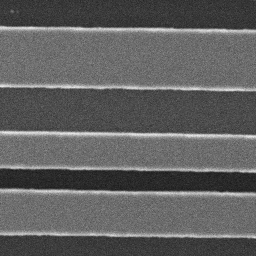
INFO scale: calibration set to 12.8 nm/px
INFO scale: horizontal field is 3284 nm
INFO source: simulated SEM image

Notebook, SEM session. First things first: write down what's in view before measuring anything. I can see lines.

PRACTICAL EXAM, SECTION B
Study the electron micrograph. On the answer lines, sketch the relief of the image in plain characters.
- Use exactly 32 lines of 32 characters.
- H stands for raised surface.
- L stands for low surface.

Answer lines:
LLLLLLLLLLLLLLLLLLLLLLLLLLLLLLLL
LLLLLLLLLLLLLLLLLLLLLLLLLLLLLLLL
LLLLLLLLLLLLLLLLLLLLLLLLLLLLLLLL
HHHHHHLLLLLLLLLLLLLLLLLLLLLLLLLL
HHHHHHHHHHHHHHHHHHHHHHHHHHHHHHHH
HHHHHHHHHHHHHHHHHHHHHHHHHHHHHHHH
HHHHHHHHHHHHHHHHHHHHHHHHHHHHHHHH
HHHHHHHHHHHHHHHHHHHHHHHHHHHHHHHH
HHHHHHHHHHHHHHHHHHHHHHHHHHHHHHHH
HHHHHHHHHHHHHHHHHHHHHHHHHHHHHHHH
HHHHHHHHHHHHHHHHHHHHHHHHHHHHHHHH
LLLLLLLLLLLLLLLLLLLLLLLLLLLLLLLL
LLLLLLLLLLLLLLLLLLLLLLLLLLLLLLLL
LLLLLLLLLLLLLLLLLLLLLLLLLLLLLLLL
LLLLLLLLLLLLLLLLLLLLLLLLLLLLLLLL
LLLLLLLLLLLLLLLLLLLLLLLLLLLLLLLL
LLLLLLLLLLLLLLLLLLLLLLLLLLLLLLLL
HHHHHHHHHHHHHHHHHHHHHHHHHHHHHHHH
HHHHHHHHHHHHHHHHHHHHHHHHHHHHHHHH
HHHHHHHHHHHHHHHHHHHHHHHHHHHHHHHH
HHHHHHHHHHHHHHHHHHHHHHHHHHHHHHHH
LLLLLLLLLLLLLLLLLLLLLLLLLLLLLLHH
LLLLLLLLLLLLLLLLLLLLLLLLLLLLLLLL
LLLLLLLLLLLLLLLLLLLLLLLLLLLLLLLL
HHHHHHHHHHHHHHHHHHHHHHHHHHHHHHHH
HHHHHHHHHHHHHHHHHHHHHHHHHHHHHHHH
HHHHHHHHHHHHHHHHHHHHHHHHHHHHHHHH
HHHHHHHHHHHHHHHHHHHHHHHHHHHHHHHH
HHHHHHHHHHHHHHHHHHHHHHHHHHHHHHHH
LLLLLLLLLLLLLHHHHHHHHHHHHHHHHHHH
LLLLLLLLLLLLLLLLLLLLLLLLLLLLLLLL
LLLLLLLLLLLLLLLLLLLLLLLLLLLLLLLL